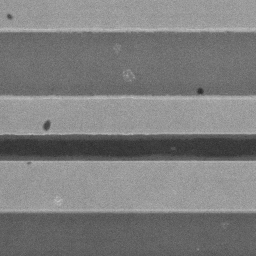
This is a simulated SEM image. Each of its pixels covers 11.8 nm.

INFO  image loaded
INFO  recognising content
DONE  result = lines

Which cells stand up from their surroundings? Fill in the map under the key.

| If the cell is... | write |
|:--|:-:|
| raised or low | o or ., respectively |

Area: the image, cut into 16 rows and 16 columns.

oooooooooooooooo
oooooooooooooooo
................
................
................
................
oooooooooooooooo
oooooooooooooooo
................
................
oooooooooooooooo
oooooooooooooooo
oooooooooooooooo
................
................
................